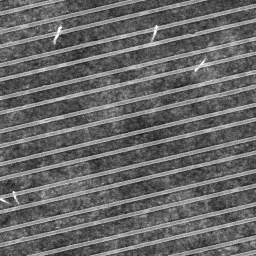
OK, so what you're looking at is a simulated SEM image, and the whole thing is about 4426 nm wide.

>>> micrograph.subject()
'parallel lines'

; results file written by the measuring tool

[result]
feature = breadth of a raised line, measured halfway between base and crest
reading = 56.9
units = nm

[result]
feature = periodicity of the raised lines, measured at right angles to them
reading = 16.1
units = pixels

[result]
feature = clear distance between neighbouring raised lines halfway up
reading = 212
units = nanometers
